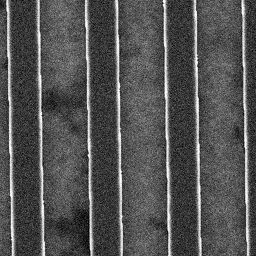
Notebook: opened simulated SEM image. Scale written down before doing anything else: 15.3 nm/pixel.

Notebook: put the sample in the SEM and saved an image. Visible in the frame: lines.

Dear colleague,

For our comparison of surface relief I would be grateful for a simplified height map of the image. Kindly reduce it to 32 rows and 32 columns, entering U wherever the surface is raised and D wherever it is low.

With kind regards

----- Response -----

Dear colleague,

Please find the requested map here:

DUUUUDDDDDDUUUUDDDDDUUUUDDDDDDUU
DUUUUDDDDDDUUUUDDDDDDUUUUDDDDDUU
DUUUUDDDDDDUUUUDDDDDDUUUUDDDDDUU
DUUUUDDDDDDUUUUDDDDDDUUUUDDDDDUU
DUUUUDDDDDDUUUUDDDDDDUUUUDDDDDUU
DUUUUDDDDDDUUUUDDDDDDUUUUDDDDDUU
DUUUUDDDDDDUUUUDDDDDDUUUUDDDDDUU
DUUUUDDDDDDUUUUDDDDDDUUUUDDDDDUU
DUUUUDDDDDDUUUUDDDDDDUUUUDDDDDDU
DUUUUDDDDDDUUUUDDDDDDUUUUDDDDDDU
DUUUUDDDDDDUUUUDDDDDDUUUUDDDDDDU
DUUUUDDDDDDUUUUDDDDDDUUUUDDDDDDU
DUUUUDDDDDDUUUUDDDDDDUUUUDDDDDDU
DUUUUDDDDDDUUUUDDDDDDUUUUDDDDDDU
DUUUUDDDDDDUUUUDDDDDDUUUUDDDDDDU
DUUUUDDDDDDUUUUDDDDDDUUUUDDDDDDU
DUUUUDDDDDDUUUUDDDDDDUUUUDDDDDDU
DUUUUDDDDDDUUUUDDDDDDUUUUDDDDDDU
DUUUUDDDDDDUUUUDDDDDDUUUUDDDDDDU
DUUUUDDDDDDUUUUDDDDDDUUUUDDDDDDU
DUUUUDDDDDDUUUUDDDDDDUUUUDDDDDDU
DUUUUDDDDDDUUUUDDDDDDUUUUDDDDDDU
DUUUUDDDDDDUUUUDDDDDDUUUUDDDDDDU
DUUUUDDDDDDUUUUDDDDDDUUUUDDDDDDU
DUUUUDDDDDDUUUUDDDDDDUUUUDDDDDDU
DUUUUDDDDDDUUUUDDDDDDUUUUDDDDDDU
DUUUUDDDDDDUUUUDDDDDDUUUUDDDDDDU
DUUUUDDDDDDUUUUDDDDDDUUUUDDDDDDU
DUUUUDDDDDDUUUUDDDDDDUUUUDDDDDDU
DUUUUDDDDDDUUUUDDDDDDUUUUDDDDDDU
DDUUUUDDDDDUUUUDDDDDDUUUUDDDDDDU
DDUUUUDDDDDUUUUDDDDDDUUUUDDDDDDU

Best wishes